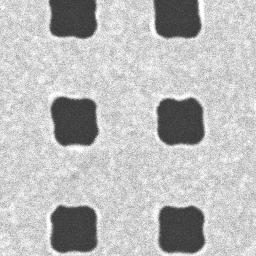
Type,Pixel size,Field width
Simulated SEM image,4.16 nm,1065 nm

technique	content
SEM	holes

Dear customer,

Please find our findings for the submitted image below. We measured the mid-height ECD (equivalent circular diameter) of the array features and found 212 nm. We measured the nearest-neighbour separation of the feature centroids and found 443 nm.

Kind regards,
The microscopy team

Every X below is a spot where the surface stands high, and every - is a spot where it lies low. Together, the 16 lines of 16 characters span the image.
XXX---XXXX--XXXX
XXX---XXXX---XXX
XXXXXXXXXXXXXXXX
XXXXXXXXXXXXXXXX
XXXXXXXXXXXXXXXX
XXXXXXXXXXXXXXXX
XXX---XXXX--XXXX
XXX---XXXX---XXX
XXX---XXXX---XXX
XXXXXXXXXXXXXXXX
XXXXXXXXXXXXXXXX
XXXXXXXXXXXXXXXX
XXXXXXXXXXXXXXXX
XXX---XXXX---XXX
XXX---XXXX---XXX
XXX---XXXX---XXX